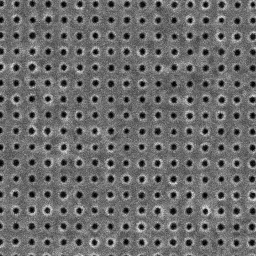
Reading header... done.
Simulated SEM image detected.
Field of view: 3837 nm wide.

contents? a regular array of holes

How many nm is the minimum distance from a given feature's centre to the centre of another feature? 230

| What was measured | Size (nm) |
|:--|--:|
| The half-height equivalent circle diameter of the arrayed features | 103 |